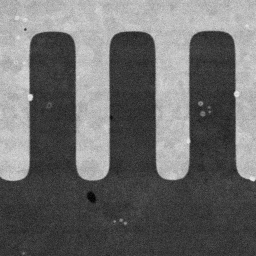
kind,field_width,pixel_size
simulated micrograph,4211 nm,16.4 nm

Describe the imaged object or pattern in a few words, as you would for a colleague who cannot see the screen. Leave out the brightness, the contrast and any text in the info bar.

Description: groups of lines, slits or small figures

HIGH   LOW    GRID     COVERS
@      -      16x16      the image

@@@@@@@@@@@@@@@@
@@@@@@@@@@@@@@@@
@@---@@---@@---@
@@---@@---@@---@
@@---@@---@@---@
@@---@@---@@---@
@@---@@---@@---@
@@---@@---@@---@
@@---@@---@@---@
@@---@@---@@---@
@@---@@---@@---@
----------------
----------------
----------------
----------------
----------------